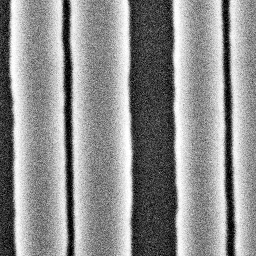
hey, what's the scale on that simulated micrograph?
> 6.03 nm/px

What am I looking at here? lines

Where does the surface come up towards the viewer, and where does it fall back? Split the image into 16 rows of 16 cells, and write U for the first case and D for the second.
DUUUUUUUDDDUUUUU
DUUUUUUUDDDUUUUU
DUUUUUUUDDDUUUUU
DUUUUUUUDDDUUUUU
DUUUUUUUDDDUUUUU
DUUUUUUUDDDUUUUU
DUUUUUUUDDDUUUUU
DUUUUUUUDDDUUUUU
DUUUUUUUDDDUUUUU
DUUUUUUUDDDUUUUU
DUUUUUUUDDDUUUUU
DUUUUUUUDDDUUUUU
DUUUUUUUDDDUUUUU
DUUUUUUUDDDUUUUU
DUUUUUUUDDDUUUUU
DUUUUUUUDDDUUUUU